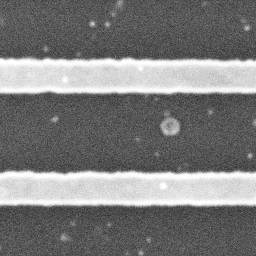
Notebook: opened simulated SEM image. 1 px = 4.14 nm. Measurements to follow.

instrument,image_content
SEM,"lines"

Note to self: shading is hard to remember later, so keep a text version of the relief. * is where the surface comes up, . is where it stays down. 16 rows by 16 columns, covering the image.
................
................
................
................
****************
****************
................
................
................
................
................
****************
****************
................
................
................